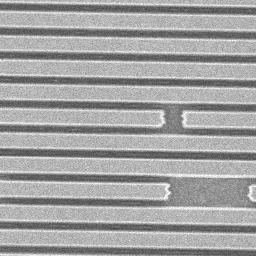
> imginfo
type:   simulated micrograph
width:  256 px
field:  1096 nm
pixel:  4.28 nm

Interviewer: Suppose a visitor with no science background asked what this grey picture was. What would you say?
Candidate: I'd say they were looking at parallel lines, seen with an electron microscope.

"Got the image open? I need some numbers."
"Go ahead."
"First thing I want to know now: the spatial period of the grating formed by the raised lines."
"0.104 um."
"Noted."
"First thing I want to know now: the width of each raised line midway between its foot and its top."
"0.068 µm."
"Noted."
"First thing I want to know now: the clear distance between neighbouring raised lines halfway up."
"7.87 px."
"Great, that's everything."